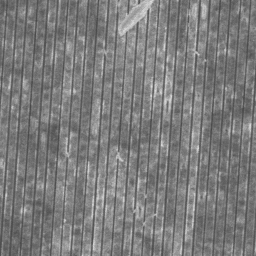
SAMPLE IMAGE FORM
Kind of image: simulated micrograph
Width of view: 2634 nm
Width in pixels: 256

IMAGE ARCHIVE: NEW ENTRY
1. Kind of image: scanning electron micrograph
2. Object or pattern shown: parallel lines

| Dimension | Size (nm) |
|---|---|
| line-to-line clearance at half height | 24.4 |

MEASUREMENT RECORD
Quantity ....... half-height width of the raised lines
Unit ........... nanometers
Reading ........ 84.7